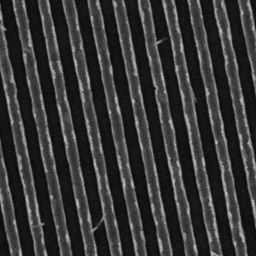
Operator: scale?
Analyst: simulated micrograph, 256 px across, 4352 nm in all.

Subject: parallel lines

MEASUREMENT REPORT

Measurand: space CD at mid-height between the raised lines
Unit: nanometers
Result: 232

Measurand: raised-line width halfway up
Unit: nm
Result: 184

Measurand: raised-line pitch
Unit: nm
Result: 418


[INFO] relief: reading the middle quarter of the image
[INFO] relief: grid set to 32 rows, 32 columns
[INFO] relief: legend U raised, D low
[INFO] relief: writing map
DDDUUUDDDUUUDDDUUUDDDDUUDDDDUUDD
DDDUUUDDDUUUDDDDUUDDDDUUDDDDUUUD
DDDUUUDDDDUUDDDDUUDDDDUUUDDDUUUD
DDDDUUDDDDUUDDDDUUUDDDUUUDDDDUUD
DDDDUUDDDDUUDDDDUUUDDDDUUDDDDUUD
DDDDUUDDDDUUUDDDUUUDDDDUUDDDDUUU
DDDDUUUDDDUUUDDDDUUDDDDUUDDDDUUU
DDDDUUUDDDUUUDDDDUUDDDDUUUDDDUUU
UDDDUUUDDDDUUDDDDUUUDDDUUUDDDDUU
UDDDDUUDDDDUUDDDDUUUDDDUUUDDDDUU
UDDDDUUDDDDUUDDDDUUUDDDUUUDDDDUU
UDDDDUUDDDDUUUDDDUUUDDDDUUDDDDUU
UDDDDUUUDDDUUUDDDDUUDDDDUUDDDDUU
UUDDDUUUDDDDUUDDDDUUDDDDUUUDDDDU
UUDDDDUUDDDDUUDDDDUUUDDDUUUDDDDU
UUDDDDUUDDDDUUUDDDUUUDDDUUUDDDDU
UUDDDDUUUDDDUUUDDDUUUDDDDUUDDDDU
UUUDDDUUUDDDUUUDDDDUUDDDDUUDDDDU
UUUDDDUUUDDDUUUDDDDUUDDDDUUUDDDU
UUUDDDDUUDDDDUUDDDDUUDDDDUUUDDDU
DUUDDDDUUDDDDUUDDDDUUUDDDUUUDDDD
DUUDDDDUUUDDDUUUDDDUUUDDDDUUDDDD
DUUUDDDUUUDDDUUUDDDDUUDDDDUUDDDD
DUUUDDDUUUDDDDUUDDDDUUDDDDUUDDDD
DUUUDDDUUUDDDDUUDDDDUUUDDDUUUDDD
DUUUDDDDUUDDDDUUDDDDUUUDDDUUUDDD
DDUUDDDDUUDDDDUUUDDDDUUDDDDUUDDD
DDUUDDDDUUUDDDUUUDDDDUUDDDDUUDDD
DDUUUDDDUUUDDDUUUDDDDUUDDDDUUDDD
DDUUUDDDDUUDDDDUUDDDDUUUDDDUUUDD
DDUUUDDDDUUDDDDUUDDDDUUUDDDUUUDD
DDDUUDDDDUUDDDDUUUDDDUUUDDDDUUDD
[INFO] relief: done